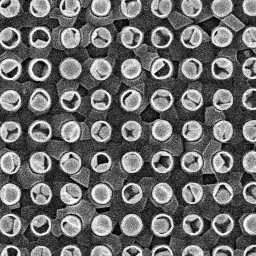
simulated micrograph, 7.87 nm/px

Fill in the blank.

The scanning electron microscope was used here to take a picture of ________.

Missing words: a regular array of raised bodies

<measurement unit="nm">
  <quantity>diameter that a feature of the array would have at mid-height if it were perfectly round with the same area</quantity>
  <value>145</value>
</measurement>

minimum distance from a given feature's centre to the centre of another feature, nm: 166